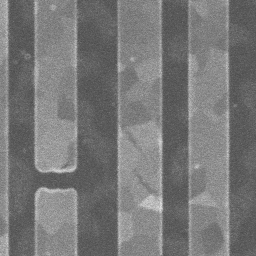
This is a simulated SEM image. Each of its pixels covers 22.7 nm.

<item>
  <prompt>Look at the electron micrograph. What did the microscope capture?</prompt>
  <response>one or a few lines or trenches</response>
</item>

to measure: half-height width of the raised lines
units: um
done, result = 0.904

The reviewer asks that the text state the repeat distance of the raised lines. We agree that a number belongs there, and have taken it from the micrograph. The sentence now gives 1730 nanometers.